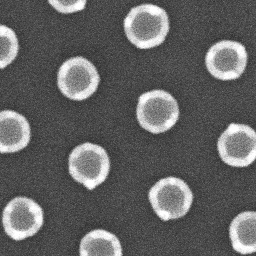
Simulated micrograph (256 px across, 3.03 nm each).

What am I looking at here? raised bodies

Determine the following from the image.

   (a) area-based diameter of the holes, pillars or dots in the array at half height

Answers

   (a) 126 nanometers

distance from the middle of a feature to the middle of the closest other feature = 85.5 px